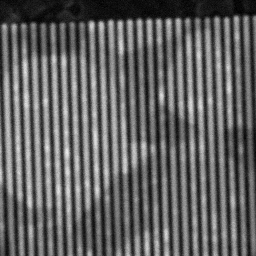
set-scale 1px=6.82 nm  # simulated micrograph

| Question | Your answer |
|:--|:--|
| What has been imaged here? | parallel lines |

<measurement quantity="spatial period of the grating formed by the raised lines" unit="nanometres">66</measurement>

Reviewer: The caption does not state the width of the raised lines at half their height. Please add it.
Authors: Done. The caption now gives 30.7 nanometres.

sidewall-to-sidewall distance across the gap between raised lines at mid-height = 5.37 pixels